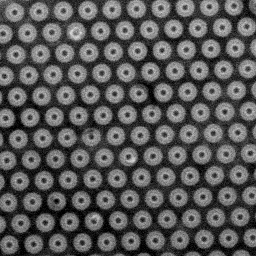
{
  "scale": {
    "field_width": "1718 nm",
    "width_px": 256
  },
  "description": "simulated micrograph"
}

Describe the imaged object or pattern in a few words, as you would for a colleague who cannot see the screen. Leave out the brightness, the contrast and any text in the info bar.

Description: an array of small figures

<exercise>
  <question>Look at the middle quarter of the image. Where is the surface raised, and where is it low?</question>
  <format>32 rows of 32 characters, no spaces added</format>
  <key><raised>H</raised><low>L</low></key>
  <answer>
LLHHLLLLHHHLLLHHHLLLHHHLLLHHHHLL
LHHHHLLHHHHHLHHHHHLHHHHHLLHHHHLL
LHHHHHLHHHHHLHHHHHLHHHHHLLHHHHLL
LHHHHLLHHHHLLLHHHLLLHHHLLLHHHLLL
LLHHLLLLLHLLLLLLLLLLLLLLLLLLLLLL
LLLLLLLLLLLLHHLLLHHHLLLHHHLLLHHH
HHLLLHHHLLLHHHHLLHHHHLLHHHHLLHHH
HHHLHHHHHLHHHHHLLHHHHLLHHHHLLHHH
HHHLHHHHHLLHHHHLLHHHHLLHHHHLLHHH
HHLLLHHHLLLLHHLLLLLLLLLLLLLLLLLL
LLLLLLLLLLLLLLLLLLLLLHHLLLLHHLLL
LLHHHLLLHHHHLLHHHHLLHHHHLLHHHHLL
LLHHHHLLHHHHLLHHHHLLHHHHLLHHHHLL
LHHHHHLLHHHHLLHHHHLLHHHHLLHHHHLL
LLHHHLLLHHHLLLLHHLLLLHHLLLLLLLLL
LLLLLLLLLLLLLLLLLLLLLLLLHHLLLLHH
HHLLLHHHLLLHHHHLLHHHHLLHHHHLLHHH
HHHLLHHHHLLHHHHLLHHHHLLHHHHLLHHH
HHHLLHHHHLLHHHHLLHHHHLLHHHHLLHHH
HHHLLHHHHLLHHHHLLHHHHLLLHHHLLLHH
HHLLLLLLLLLLLLLLLLLLLLLLLLLLLLLL
LLLHHLLLLHHLLLLHHHLLLHHHLLLHHHLL
LLHHHHLLHHHHLLHHHHLLHHHHLLHHHHLL
LLHHHHLLHHHHLLHHHHLLHHHHLLHHHHLL
LLHHHHLLHHHHLLHHHHLLLHHHLLLHHHLL
LLLHHLLLLHHLLLLLLLLLLLLLLLLLLLLL
LLLLLLLLLLLLHHLLLLHHHLLLHHHLLLHH
HHHLLHHHHLLHHHHLLHHHHLLHHHHHLHHH
HHHLLHHHHLLHHHHLLHHHHHLHHHHHLHHH
HHHLLHHHHLLHHHHLLHHHHLLLHHHLLLHH
HHHLLLHHHLLLHHHLLLHHLLLLLLLLLLLL
LLLLLLLLLLLLLLLLLLLLLLHLLLLHHHLL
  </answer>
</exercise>